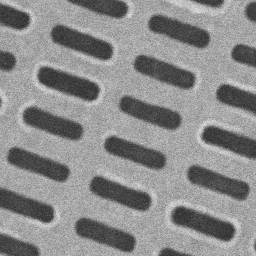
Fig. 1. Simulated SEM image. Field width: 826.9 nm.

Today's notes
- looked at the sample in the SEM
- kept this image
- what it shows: a regular array of holes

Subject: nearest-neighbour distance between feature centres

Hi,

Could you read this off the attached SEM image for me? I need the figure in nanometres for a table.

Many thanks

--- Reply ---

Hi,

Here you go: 139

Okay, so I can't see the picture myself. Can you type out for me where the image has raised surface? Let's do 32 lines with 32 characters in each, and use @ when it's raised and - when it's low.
-@@@@@@@@-------@@@@@@@@@---@@@-
---@@@@@@@@-----@@@@@@@@@@@@@@--
----@@@@@@@@@@@@@@@---@@@@@@@@@-
@--@@@@--@@@@@@@@@@------@@@@@@@
@@@@@@------@@@@@@@@------@@@@@@
@@@@@@@-------@@@@@@@@@---@@@@@@
-@@@@@@@@@----@@@@@@@@@@@@@@@---
--@@@@@@@@@@--@@@---@@@@@@@@@---
--@@@--@@@@@@@@@@------@@@@@@@@-
@@@@@-----@@@@@@@@------@@@@@@@@
@@@@@-------@@@@@@@@----@@@@-@@@
@@@@@@@-----@@@@@@@@@@@@@@@----@
@@@@@@@@@@--@@@---@@@@@@@@@-----
@@@--@@@@@@@@@@------@@@@@@@@---
@@@-----@@@@@@@@-------@@@@@@@@@
@@@-------@@@@@@@@-----@@@@@@@@@
@@@@@------@@@@@@@@@@@@@@-----@@
@@@@@@@@@-@@@---@@@@@@@@@-------
@--@@@@@@@@@@------@@@@@@@@-----
@----@@@@@@@@@-------@@@@@@@@@--
@-------@@@@@@@@@----@@@@@@@@@@@
@@@@-----@@@@@@@@@@@@@@----@@@@@
@@@@@@@-@@@---@@@@@@@@@-------@@
-@@@@@@@@@@-----@@@@@@@@@------@
---@@@@@@@@@-------@@@@@@@@@---@
------@@@@@@@@@----@@@@@@@@@@@@@
@------@@@@@@@@@@@@@@----@@@@@@@
@@@@---@@@--@@@@@@@@@-------@@@@
@@@@@@@@@------@@@@@@@@@-----@@@
-@@@@@@@@@-------@@@@@@@@@---@@@
----@@@@@@@@@----@@@@@@@@@@@@@@@
-----@@@@@@@@@@-@@@@---@@@@@@@@@